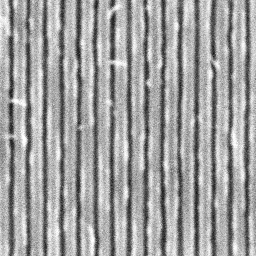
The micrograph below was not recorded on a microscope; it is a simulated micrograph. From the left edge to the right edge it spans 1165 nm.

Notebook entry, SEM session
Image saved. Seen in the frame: parallel lines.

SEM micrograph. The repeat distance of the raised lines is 0.0766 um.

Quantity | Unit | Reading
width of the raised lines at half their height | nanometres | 48.4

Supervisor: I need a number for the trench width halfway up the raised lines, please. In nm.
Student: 26.2